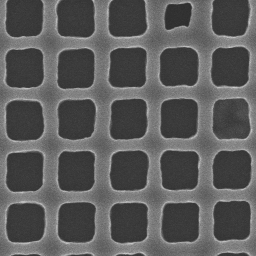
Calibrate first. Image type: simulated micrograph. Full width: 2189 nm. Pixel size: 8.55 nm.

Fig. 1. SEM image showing a regular array of holes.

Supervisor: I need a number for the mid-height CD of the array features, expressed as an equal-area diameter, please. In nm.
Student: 361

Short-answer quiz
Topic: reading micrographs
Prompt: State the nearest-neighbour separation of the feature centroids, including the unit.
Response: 436 nm